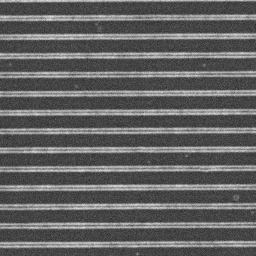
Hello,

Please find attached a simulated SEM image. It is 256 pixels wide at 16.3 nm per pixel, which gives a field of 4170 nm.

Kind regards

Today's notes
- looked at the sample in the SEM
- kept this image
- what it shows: parallel lines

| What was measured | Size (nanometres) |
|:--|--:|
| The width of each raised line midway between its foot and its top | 57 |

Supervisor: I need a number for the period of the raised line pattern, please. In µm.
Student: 0.308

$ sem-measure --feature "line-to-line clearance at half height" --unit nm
250